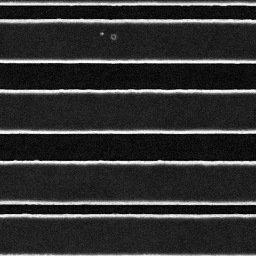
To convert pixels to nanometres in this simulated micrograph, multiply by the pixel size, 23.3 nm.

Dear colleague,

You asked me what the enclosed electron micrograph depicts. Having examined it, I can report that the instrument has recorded lines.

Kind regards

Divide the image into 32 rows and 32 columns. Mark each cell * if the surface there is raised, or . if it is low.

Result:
........**...***......**...**.**
................................
.......*........................
********************************
********************************
********************************
********************************
********************************
................................
................................
................................
********************************
********************************
********************************
********************************
********************************
********************************
................................
................................
................................
********************************
********************************
********************************
********************************
********************************
................................
................................
********************************
********************************
********************************
********************************
********************************